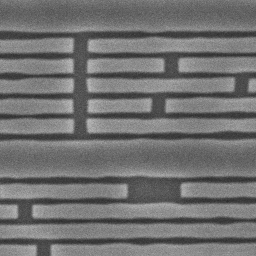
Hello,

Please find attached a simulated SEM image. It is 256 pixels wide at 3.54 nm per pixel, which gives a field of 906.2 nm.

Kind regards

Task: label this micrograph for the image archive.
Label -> groups of lines, slits or small figures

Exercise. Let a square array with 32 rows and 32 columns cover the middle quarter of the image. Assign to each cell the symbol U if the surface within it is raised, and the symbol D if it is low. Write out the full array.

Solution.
UUDDDDUUUUUUUUUUUUUUUUUUUDDDDUUU
UUDDDDUUUUUUUUUUUUUUUUUUUDDDDUUU
DDDDDDDDDDDDDDDDDDDDDDDDDDDDDDDD
DDDDDDDDDDDDDDDDDDDDDDDDDDDDDDDD
UUDDDDUUUUUUUUUUUUUUUUUUUUUUUUUU
UUDDDDUUUUUUUUUUUUUUUUUUUUUUUUUU
UUDDDDUUUUUUUUUUUUUUUUUUUUUUUUUU
DDDDDDDDDDDDDDDDDDDDDDDDDDDDDDDD
DDDDDDDDDDDDDDDDDDDDDDDDDDDDDDDD
UUDDDDUUUUUUUUUUUUUUUUDDDDUUUUUU
UUDDDDUUUUUUUUUUUUUUUUDDDDUUUUUU
UUDDDDUUUUUUUUUUUUUUUUDDDDUUUUUU
DDDDDDDDDDDDDDDDDDDDDDDDDDDDDDDD
DDDDDDDDDDDDDDDDDDDDDDDDDDDDDDDD
UUDDDDUUUUUUUUUUUUUUUUUUUUUUUUUU
UUDDDDUUUUUUUUUUUUUUUUUUUUUUUUUU
UUDDDDUUUUUUUUUUUUUUUUUUUUUUUUUU
DDDDDDDDDDDDDDDDDDDDDDDDDDDDDDDD
DDDDDDDDDDDDDDDDDDDDDDDDDDDDDDDD
UUUUUUUUUUUUUUUUUUUUUUUUUUUUUUUU
UUUUUUUUUUUUUUUUUUUUUUUUUUUUUUUU
UUUUUUUUUUUUUUUUUUUUUUUUUUUUUUUU
UUUUUUUUUUUUUUUUUUUUUUUUUUUUUUUU
UUUUUUUUUUUUUUUUUUUUUUUUUUUUUUUU
UUUUUUUUUUUUUUUUUUUUUUUUUUUUUUUU
UUUUUUUUUUUUUUUUUUUUUUUUUUUUUUUU
UUUUUUUUUUUUUUUUUUUUUUUUUUUUUUUU
UUUUUUUUUUUUUUUUUUUUUUUUUUUUUUUU
DDDDDDDDDDDDDDDDDDDDDDDDDDDDDDDD
DDDDDDDDDDDDDDDDDDDDDDDDDDDDDDDD
UUUUUUUUUUUUUUUUDDDDDDDDDDDDDUUU
UUUUUUUUUUUUUUUUDDDDDDDDDDDDDUUU